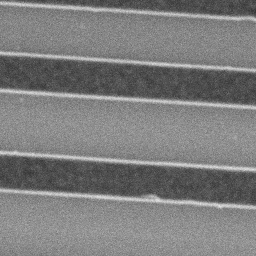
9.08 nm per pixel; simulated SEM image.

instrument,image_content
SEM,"one or a few lines or trenches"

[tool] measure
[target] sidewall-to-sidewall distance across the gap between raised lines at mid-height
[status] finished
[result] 500 nanometers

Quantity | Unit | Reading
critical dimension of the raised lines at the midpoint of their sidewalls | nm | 349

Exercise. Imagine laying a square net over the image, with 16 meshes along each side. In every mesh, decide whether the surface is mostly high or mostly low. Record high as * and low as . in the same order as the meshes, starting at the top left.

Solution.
....************
................
................
***.............
****************
****************
............****
................
................
................
***************.
****************
........********
................
................
................